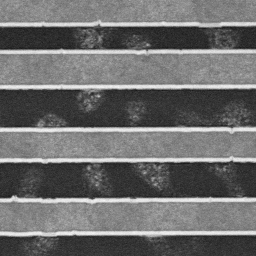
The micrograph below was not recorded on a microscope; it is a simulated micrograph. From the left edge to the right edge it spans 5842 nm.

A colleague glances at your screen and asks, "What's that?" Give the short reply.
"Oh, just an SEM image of one or a few lines or trenches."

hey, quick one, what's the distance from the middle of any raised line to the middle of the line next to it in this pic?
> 1680 nm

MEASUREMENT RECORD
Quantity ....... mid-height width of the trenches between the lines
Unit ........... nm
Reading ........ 936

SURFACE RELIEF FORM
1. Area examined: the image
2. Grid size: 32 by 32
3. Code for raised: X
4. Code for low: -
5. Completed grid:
XXXXXXXXXXXXXXXXXXXXXXXXXXXXXXXX
XXXXXXXXXXXXXXXXXXXXXXXXXXXXXXXX
XXXXXXXXXXXXXXXXXXXXXXXXXXXXXXXX
--------------------------------
--------------------------------
--------------------------------
-------X------------------------
XXXXXXXXXXXXXXXXXXXXXXXXXXXXXXXX
XXXXXXXXXXXXXXXXXXXXXXXXXXXXXXXX
XXXXXXXXXXXXXXXXXXXXXXXXXXXXXXXX
XXXXXXXXXXXXXXXXXXXXXXXXXXXXXXXX
--------------------------------
--------------------------------
--------------------------------
--------------------------------
--------------------------------
XXXXXXXXXXXXXXXXXXXXXXXXXXXXXXXX
XXXXXXXXXXXXXXXXXXXXXXXXXXXXXXXX
XXXXXXXXXXXXXXXXXXXXXXXXXXXXXXXX
XXXXXXXXXXXXXXXXXXXXXXXXXXXXXXXX
--------------------------------
--------------------------------
--------------------------------
--------------------------------
--------------------------------
XXXXXXXXXXXXXXXXXXXXXXXXXXXXXXXX
XXXXXXXXXXXXXXXXXXXXXXXXXXXXXXXX
XXXXXXXXXXXXXXXXXXXXXXXXXXXXXXXX
XXXXXXXXXXXXXXXXXXXXXXXXXXXXXXXX
--------------------------------
--------------------------------
--------------------------------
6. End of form